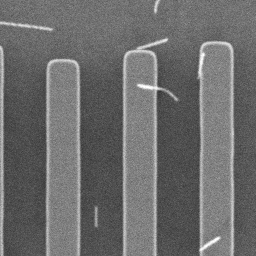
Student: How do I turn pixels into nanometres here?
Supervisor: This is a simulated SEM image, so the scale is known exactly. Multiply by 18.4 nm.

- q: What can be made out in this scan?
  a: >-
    groups of lines, slits or small figures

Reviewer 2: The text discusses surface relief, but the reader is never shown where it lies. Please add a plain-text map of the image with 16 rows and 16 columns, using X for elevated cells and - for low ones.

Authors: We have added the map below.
----------------
----------------
----------------
--------XX---XX-
---XX---XX--XXX-
---XX---XX---XX-
---XX---XX---XX-
---XX---XX---XX-
---XX---XX---XX-
---XX---XX---XX-
---XX---XX---XX-
---XX---XX---XX-
---XX---XX---XX-
---XX---XX---XX-
---XX---XX---XX-
---XX---XX---XX-